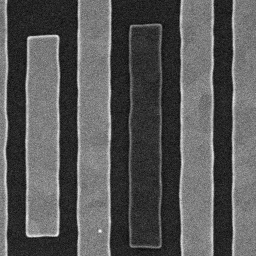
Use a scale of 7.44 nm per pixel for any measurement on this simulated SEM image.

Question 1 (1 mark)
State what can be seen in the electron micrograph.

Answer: wiring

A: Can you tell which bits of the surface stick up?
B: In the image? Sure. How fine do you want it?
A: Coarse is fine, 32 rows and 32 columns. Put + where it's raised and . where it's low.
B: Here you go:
+.........++++.........++++..+++
+.........++++.........++++..+++
+.........++++.........++++..+++
+.........++++..++++...++++..+++
+....++...++++..++++...++++..+++
+..++++...++++..++++...++++..+++
+..++++...++++..++++...++++..+++
+..++++...++++..++++...++++..+++
+..++++...++++..++++...++++..+++
+..++++...++++..++++...++++..+++
+..++++...++++..++++...++++..+++
+..++++...++++..++++...++++..+++
+..++++...++++..++++...++++..+++
+..++++...++++..++++...++++..+++
+..++++...++++..++++...++++..+++
+..++++...++++..++++...++++..+++
+..++++...++++..++++...++++..+++
+..++++...++++..++++...++++..+++
+..++++...++++..++++...++++..+++
+..++++...++++..++++...++++..+++
+..++++...++++..++++...++++..+++
+..++++...++++..++++...++++..+++
+..++++...++++..++++...++++..+++
+..++++...++++..++++...++++..+++
+..++++...++++..++++...++++..+++
+..++++...++++..++++...++++..+++
+..++++...++++..++++...++++..+++
+...+++...++++..++++...++++..+++
+..++++...++++..++++...++++..+++
+...+.....++++..++++...++++..+++
+.........++++..++++...++++..+++
+.........++++.........++++..+++